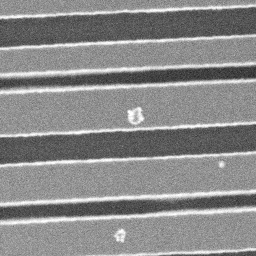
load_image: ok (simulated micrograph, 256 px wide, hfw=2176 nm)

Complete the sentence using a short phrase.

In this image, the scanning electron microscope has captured lines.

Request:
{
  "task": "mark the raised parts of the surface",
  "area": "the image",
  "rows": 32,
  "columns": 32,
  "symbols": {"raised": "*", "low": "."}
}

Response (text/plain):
********************************
***************.................
................................
................................
..............................**
..........**********************
********************************
********************************
*******************.............
................................
.......................*********
.*******************************
********************************
********************************
********************************
******************************..
**********......................
................................
................................
........................********
....****************************
********************************
********************************
********************************
*******************.............
................................
..........................******
.......*************************
********************************
********************************
********************************
**************************......